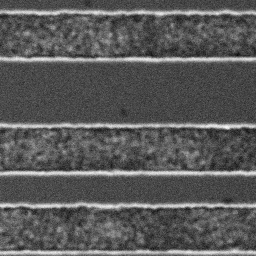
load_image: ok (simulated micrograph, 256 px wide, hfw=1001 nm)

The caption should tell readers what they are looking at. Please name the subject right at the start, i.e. lines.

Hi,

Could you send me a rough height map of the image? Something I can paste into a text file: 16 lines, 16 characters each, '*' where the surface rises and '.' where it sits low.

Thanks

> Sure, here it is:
****************
................
................
................
****************
****************
****************
****************
................
................
................
****************
****************
................
................
................